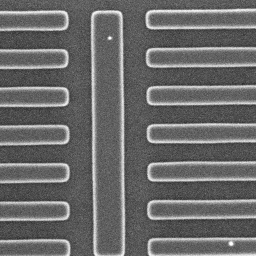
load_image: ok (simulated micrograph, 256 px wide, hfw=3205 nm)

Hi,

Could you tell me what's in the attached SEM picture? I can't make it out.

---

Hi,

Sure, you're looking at groups of lines, slits or small figures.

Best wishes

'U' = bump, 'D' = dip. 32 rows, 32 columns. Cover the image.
DDDDDDDDDDDDDDDDDDDDDDDDDDDDDDDD
DDDDUUUUDDDDUUUDDDDUUUUUUUUUUUUU
UUUUUUUUDDDDUUUDDDUUUUUUUUUUUUUU
UUUUUUUUDDDDUUUDDDDUUUUUUUUDDDDD
DDDDDDDDDDDDUUUDDDDDDDDDDDDDDDDD
DDDDDDDDDDDDUUUDDDDDDDDDDDDDDDDD
UUUUUUUUDDDDUUUDDDUUUUUUUUUUUUUU
UUUUUUUUDDDDUUUDDDUUUUUUUUUUUUUU
UUUUUDDDDDDDUUUDDDDDDDDDDDDDDDDD
DDDDDDDDDDDDUUUDDDDDDDDDDDDDDDDD
DDDDDDDDDDDDUUUDDDDDDDDDDDDDDDDD
UUUUUUUUDDDDUUUDDDUUUUUUUUUUUUUU
UUUUUUUUDDDDUUUDDDUUUUUUUUUUUUUU
DDDDDDDDDDDDUUUDDDDDDDDDDDDDDDDD
DDDDDDDDDDDDUUUDDDDDDDDDDDDDDDDD
DDDDDDDDDDDDUUUDDDDDDDDDDUUUUDDD
UUUUUUUUUDDDUUUDDDUUUUUUUUUUUUUU
UUUUUUUUDDDDUUUDDDDUUUUUUUUUUUUU
DDDDDDDDDDDDUUUDDDDDDDDDDDDDDDDD
DDDDDDDDDDDDUUUDDDDDDDDDDDDDDDDD
DDDDDDUUDDDDUUUDDDDUUUUUUUUUUUUU
UUUUUUUUUDDDUUUDDDDUUUUUUUUUUUUU
UUUUUUUUDDDDUUUDDDDUUUUUUDDDDDDD
DDDDDDDDDDDDUUUDDDDDDDDDDDDDDDDD
DDDDDDDDDDDDUUUUDDDDDDDDDDDDDDDD
UUUUUUUUDDDDUUUUDDDUUUUUUUUUUUUU
UUUUUUUUUDDDUUUUDDUUUUUUUUUUUUUU
UDDDDDDDDDDDUUUUDDDDDDDDDDDDDDDD
DDDDDDDDDDDDUUUUDDDDDDDDDDDDDDDD
DDDDDDDDDDDDUUUUDDDDDDDDDDDDDDDD
UUUUUUUUUDDDUUUUDDDUUUUUUUUUUUUU
UUUUUUUUUDDDUUUUDDDUUUUUUUUUUUUU